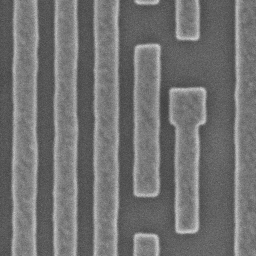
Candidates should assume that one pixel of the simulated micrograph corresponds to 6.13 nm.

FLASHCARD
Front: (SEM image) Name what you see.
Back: wiring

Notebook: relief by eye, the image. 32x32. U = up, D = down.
DDUUUDDUUDDDUUUDDDDDDDUUUDDDDDUU
DDUUUDDUUDDDUUUDDDDDDDUUUDDDDDUU
DDUUUDDUUUDDUUUDDDDDDDUUUDDDDDUU
DDUUUDDUUUDDUUUDDDDDDDUUUDDDDDUU
DDUUUDDUUUDDUUUDDDDDDDUUUDDDDDUU
DDUUUDDUUUDDUUUDDDDDDDDDDDDDDDUU
DDUUUDDUUUDDUUUDDUUUDDDDDDDDDDUU
DDUUUDDUUUDDUUUDDUUUDDDDDDDDDDUU
DDUUUDDUUDDDUUUDDUUUDDDDDDDDDDUU
DDUUDDDUUDDDUUUDDUUUDDDDDDDDDDUU
DDUUDDDUUDDDUUUDDUUUDDDDDDDDDDUU
DDUUDDDUUDDDUUUDDUUUDUUUUUDDDUUU
DDUUDDDUUDDDUUUDDUUUDUUUUUDDDUUU
DDUUDDDUUDDDUUUDDUUUDUUUUUDDDDUU
DDUUDDDUUUDDUUUDDUUUDUUUUUDDDDUU
DDUUDDDUUUDDUUUDDUUUDDUUUDDDDUUU
DDUUDDDUUUDDUUUDDUUUDDUUUDDDDUUU
DDUUDDDUUUDDUUUDDUUUDDUUUDDDDUUU
DDUUUDDUUDDDUUUDDUUUDDUUUDDDDUUU
DDUUUDDUUDDDUUUDDUUUDDUUUDDDDDUU
DDUUUDDUUDDDUUUDDUUUDDUUUDDDDDUU
DDUUDDDUUDDDUUUDDUUUDDUUUDDDDUUU
DDUUDDDUUDDDUUUDDUUUDDUUUDDDDUUU
DDUUDDDUUUDDUUUDDUUUDDUUUDDDDUUU
DDUUDDDUUUDDUUUDDDDDDDUUUDDDDUUU
DDUUDDDUUDDDUUUDDDDDDDUUUDDDDUUU
DDUUDDDUUDDDUUUDDDDDDDUUUDDDDUUU
DDUUDDDUUDDDUUUDDDDDDDUUUDDDDUUU
DDUUDDDUUDDDUUUDDDDDDDUUUDDDDUUU
DDUUDDDUUDDDUUUDDUUDDDDDDDDDDUUU
DDUUDDDUUDDDUUUDDUUUDDDDDDDDDUUU
DDUUDDDUUDDDUUUDDUUUDDDDDDDDDUUU